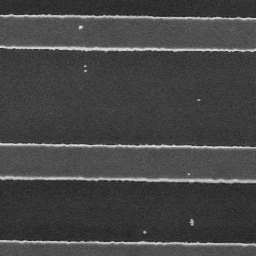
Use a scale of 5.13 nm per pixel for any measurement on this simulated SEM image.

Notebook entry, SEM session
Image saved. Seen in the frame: lines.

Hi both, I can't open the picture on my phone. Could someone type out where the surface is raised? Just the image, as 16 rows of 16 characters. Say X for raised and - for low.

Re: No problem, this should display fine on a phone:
----------------
XXXXXXXXXXXXXXXX
XXXXXXXXXXXXXXXX
----------------
----------------
----------------
----------------
----------------
----------------
XXXXXXXXXXXXXXXX
XXXXXXXXXXXXXXXX
----------------
----------------
----------------
----------------
XXXXXXXXXXXXXXXX